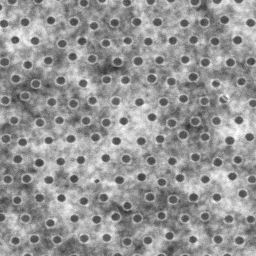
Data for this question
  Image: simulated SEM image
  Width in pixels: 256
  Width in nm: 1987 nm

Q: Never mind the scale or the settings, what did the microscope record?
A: a regular array of raised bodies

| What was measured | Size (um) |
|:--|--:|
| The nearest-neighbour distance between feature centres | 0.153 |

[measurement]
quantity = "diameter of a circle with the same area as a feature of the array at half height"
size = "0.0778 micrometres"